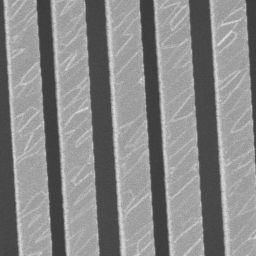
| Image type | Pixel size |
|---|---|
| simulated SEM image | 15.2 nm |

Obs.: lines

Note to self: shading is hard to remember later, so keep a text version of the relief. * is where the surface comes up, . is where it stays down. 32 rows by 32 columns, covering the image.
.***..*****..****..*****..*****.
.****.*****..****..*****..*****.
.****.*****..****..*****..*****.
.****..****..*****.*****..*****.
.****..****..*****.*****...****.
.****..****...****..****...****.
.****..****...****..****...****.
.****..****...****..****...****.
.****..****...****..****...****.
.****..****...****..****...****.
.****..****...****..****...****.
.****..****...****..****...****.
.****..****...****..****...****.
.****..****...****..****...****.
.****..****...****..****...****.
.****..****...****..****...*****
.*****.****...****..*****..*****
..****.*****..****..*****..*****
..****..****..*****.*****..*****
..****..****..*****.*****..*****
..****..****..*****..****..*****
..****..****...****..****..*****
..****..****...****..****...****
..****..****...****..****...****
..****..****...****..****...****
..****..****...****..****...****
..****..****...****..****...****
..****..****...****..****...****
..****..****...****..****...****
..****..****...****..****...****
..****..****...****..****...****
..****..****...****..****...****